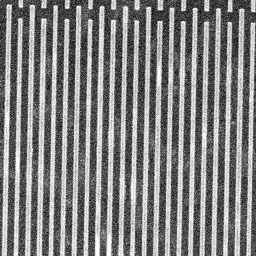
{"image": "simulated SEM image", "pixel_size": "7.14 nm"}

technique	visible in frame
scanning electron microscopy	parallel lines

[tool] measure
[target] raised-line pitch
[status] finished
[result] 11.6 px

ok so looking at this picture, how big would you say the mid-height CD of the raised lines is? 27.6 nm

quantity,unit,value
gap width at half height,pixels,7.87